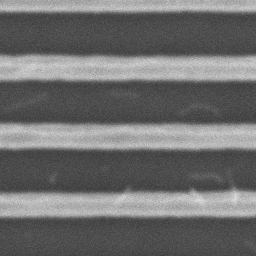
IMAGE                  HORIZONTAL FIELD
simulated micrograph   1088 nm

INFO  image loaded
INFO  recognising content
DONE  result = lines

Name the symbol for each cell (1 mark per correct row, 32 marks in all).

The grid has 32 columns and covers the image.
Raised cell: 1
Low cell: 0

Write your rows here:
11111111111111111111111111111111
00000000000000000000000000000000
00000000000000000000000000000000
00000000000000000000000000000000
00000000000000000000000000000000
00000000000000000000000000000000
00000000000000000000000000000000
11111111111111111111111111111111
11111111111111111111111111111111
11111111111111111111111111111111
00000000000000000000000000000000
00000000000000000000000000000000
00000000000000000000000000000000
00000000000000000000000000000000
00000000000000000000000000000000
00000000000000000000000000000000
11111111111111111111111111111111
11111111111111111111111111111111
01000000000011111001111111110001
00000000000000000000000000000000
00000000000000000000000000000000
00000000000000000000000000000000
00000000000000000000000000000000
00000000000000000000000000000000
11111111111111111111111111111111
11111111111111111111111111111111
11111111111111111111111111111111
00000000000000000000000000000000
00000000000000000000000000000000
00000000000000000000000000000000
00000000000000000000000000000000
00000000000000000000000000000000